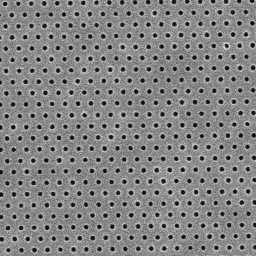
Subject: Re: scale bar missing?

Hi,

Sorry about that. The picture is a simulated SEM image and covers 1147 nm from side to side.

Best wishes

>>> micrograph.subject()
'a regular array of holes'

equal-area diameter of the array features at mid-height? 20.2 nanometres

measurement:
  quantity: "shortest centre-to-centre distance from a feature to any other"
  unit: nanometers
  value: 55.8